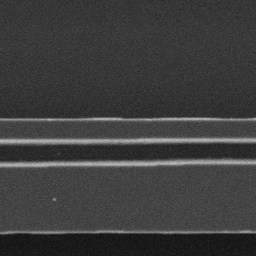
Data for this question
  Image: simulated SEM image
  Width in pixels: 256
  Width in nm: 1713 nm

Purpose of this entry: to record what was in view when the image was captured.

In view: lines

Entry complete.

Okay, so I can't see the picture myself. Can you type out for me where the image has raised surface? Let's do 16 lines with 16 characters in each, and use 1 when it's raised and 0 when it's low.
0000000000000000
0000000000000000
0000000000000000
0000000000000000
0000000000000000
0000000000000000
0000000000000000
1111111111111111
1111111111111111
1111111111111111
1111111111111111
1111111111111111
1111111111111111
1111111111111111
1111111111111111
0000000000000000